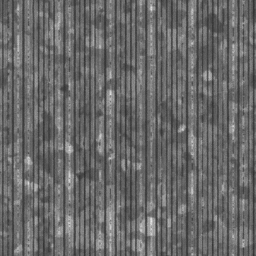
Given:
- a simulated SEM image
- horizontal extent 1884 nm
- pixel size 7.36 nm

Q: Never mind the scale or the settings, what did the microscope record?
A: parallel lines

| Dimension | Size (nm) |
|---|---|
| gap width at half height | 18.4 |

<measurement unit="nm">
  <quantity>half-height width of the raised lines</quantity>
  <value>25.7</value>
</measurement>